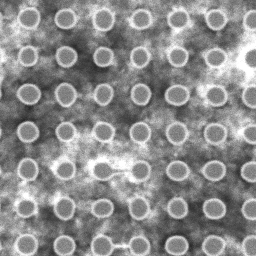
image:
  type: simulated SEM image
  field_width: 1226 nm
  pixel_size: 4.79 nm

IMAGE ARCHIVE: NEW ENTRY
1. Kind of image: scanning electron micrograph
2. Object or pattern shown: a regular array of raised bodies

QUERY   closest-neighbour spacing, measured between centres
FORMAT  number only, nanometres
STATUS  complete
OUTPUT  177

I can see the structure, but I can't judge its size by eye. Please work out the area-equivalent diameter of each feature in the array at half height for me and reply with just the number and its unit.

96.9 nm